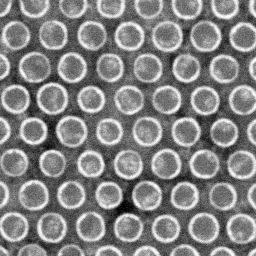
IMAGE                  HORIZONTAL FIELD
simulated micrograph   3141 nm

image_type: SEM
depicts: a regular array of raised bodies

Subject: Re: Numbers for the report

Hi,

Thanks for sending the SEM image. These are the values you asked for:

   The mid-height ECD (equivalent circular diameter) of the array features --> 337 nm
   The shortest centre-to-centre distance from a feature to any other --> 0.452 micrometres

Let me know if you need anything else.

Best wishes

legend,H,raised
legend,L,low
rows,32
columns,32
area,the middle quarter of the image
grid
HHHHHLLLHHHHHHLLLLHHHHHHLLLHHHHH
HHHHHLLLHHHHHHLLLLHHHHHHLLLHHHHH
HHHHHLLLLHHHHHLLLLHHHHHHLLLLHHHH
HHHHHLLLLLHHHHLLLLLHHHHLLLLLLHHH
LLLLLLLLLLLLLLLLLLLLLLLLLLLLLLLL
LLLLLLLLLLLLLLLLLLLLLLLLLLLLLLLL
LLLLLHHHHLLLLLHHHHHLLLLHHHHHLLLL
HLLLHHHHHLLLLHHHHHHLLLLHHHHHHLLL
HLLLHHHHHHLLLHHHHHHLLLLHHHHHHLLL
HLLLHHHHHHLLLHHHHHHLLLLHHHHHHLLL
LLLLHHHHHHLLLHHHHHHLLLLHHHHHHLLL
LLLLLHHHHLLLLLHHHHHLLLLLHHHHLLLL
LLLLLLLLLLLLLLLLLLLLLLLLLLLLLLLL
LHHLLLLLLLLLLLLLLLLLHHLLLLLLLLLL
HHHHHLLLLHHHHLLLLLHHHHHLLLLLHHHH
HHHHHLLLLHHHHHLLLLHHHHHHLLLHHHHH
HHHHHLLLHHHHHHLLLLHHHHHHLLLHHHHH
HHHHHLLLHHHHHHLLLLHHHHHHLLLHHHHH
HHHHHLLLLHHHHHLLLLHHHHHHLLLLHHHH
HHHHLLLLLLHHHLLLLLLHHHHLLLLLHHHH
LLHLLLLLLLLLLLLLLLLLLLLLLLLLLLLL
LLLLLLLLLLLLLLLLLLLLLLLLLHLLLLLL
LLLLLHHHLLLLLLHHHHLLLLLHHHHHLLLL
LLLLHHHHHLLLLHHHHHHLLLHHHHHHHLLL
LLLLHHHHHHLLLHHHHHHLLLHHHHHHHLLL
LLLLHHHHHHLLLHHHHHHLLLHHHHHHHLLL
LLLLHHHHHHLLLHHHHHHLLLHHHHHHHLLL
LLLLLHHHHLLLLLHHHHHLLLLHHHHHLLLL
LLLLLLLLLLLLLLLHHLLLLLLLLHHLLLLL
LLLLLLLLLLLLLLLLLLLLLLLLLLLLLLLL
HHHHLLLLLHHHHLLLLLHHHHHLLLLLHHHH
HHHHHLLLHHHHHHLLLLHHHHHHLLLHHHHH